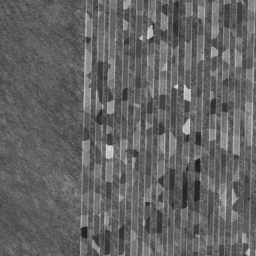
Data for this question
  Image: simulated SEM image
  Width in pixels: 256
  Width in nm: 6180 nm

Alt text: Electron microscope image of parallel lines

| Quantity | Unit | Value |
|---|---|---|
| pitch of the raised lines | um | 0.3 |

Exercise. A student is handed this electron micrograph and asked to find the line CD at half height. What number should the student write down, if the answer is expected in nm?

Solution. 157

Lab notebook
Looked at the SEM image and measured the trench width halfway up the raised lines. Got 139 nanometers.